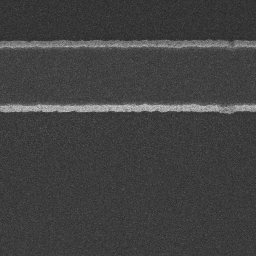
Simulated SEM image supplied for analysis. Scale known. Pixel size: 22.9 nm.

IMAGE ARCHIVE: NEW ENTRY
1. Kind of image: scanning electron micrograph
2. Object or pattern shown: one or a few lines or trenches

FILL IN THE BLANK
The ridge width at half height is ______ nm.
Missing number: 1470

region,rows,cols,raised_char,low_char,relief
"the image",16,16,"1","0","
0000000000000000
0000000000000000
0000000000000000
1111111111111111
1111111111111111
1111111111111111
1111111111111111
0000000000000000
0000000000000000
0000000000000000
0000000000000000
0000000000000000
0000000000000000
0000000000000000
0000000000000000
0000000000000000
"